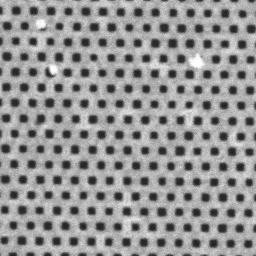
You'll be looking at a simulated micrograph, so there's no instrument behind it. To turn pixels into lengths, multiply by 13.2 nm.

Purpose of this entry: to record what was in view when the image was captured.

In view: a regular array of holes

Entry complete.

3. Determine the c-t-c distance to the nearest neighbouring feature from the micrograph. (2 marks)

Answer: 227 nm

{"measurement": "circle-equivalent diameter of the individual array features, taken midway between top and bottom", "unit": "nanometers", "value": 123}